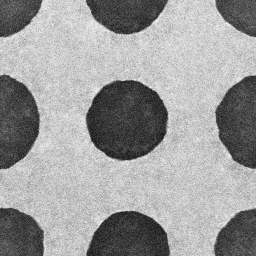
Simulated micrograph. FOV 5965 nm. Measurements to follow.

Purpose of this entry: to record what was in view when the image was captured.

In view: holes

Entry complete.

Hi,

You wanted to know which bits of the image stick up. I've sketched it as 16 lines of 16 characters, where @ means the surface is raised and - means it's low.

--@@@@----@@@@--
--@@@@---@@@@@--
@@@@@@@@@@@@@@@@
@@@@@@@@@@@@@@@@
@@@@@@@@@@@@@@@@
--@@@@---@@@@@--
--@@@@----@@@@--
--@@@------@@@--
--@@@@----@@@@--
--@@@@---@@@@@--
@@@@@@@@@@@@@@@@
@@@@@@@@@@@@@@@@
@@@@@@@@@@@@@@@@
--@@@@@--@@@@@@-
---@@@----@@@@--
---@@------@@---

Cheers